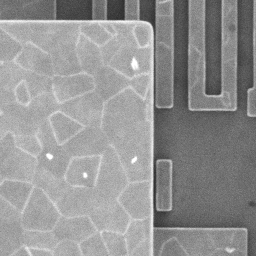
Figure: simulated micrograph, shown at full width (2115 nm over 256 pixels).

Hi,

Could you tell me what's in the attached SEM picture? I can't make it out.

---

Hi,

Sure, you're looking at wiring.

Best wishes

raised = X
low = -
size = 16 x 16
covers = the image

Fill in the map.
----------------
XXXXXXXXX-------
XXXXXXXXXX------
XXXXXXXXXX------
XXXXXXXXXX------
XXXXXXXXXX------
XXXXXXXXXX------
XXXXXXXXXX------
XXXXXXXXXX------
XXXXXXXXXX------
XXXXXXXXXX------
XXXXXXXXXX------
XXXXXXXXXX------
XXXXXXXXXX------
XXXXXXXXXX------
XXXXXXXXXX------